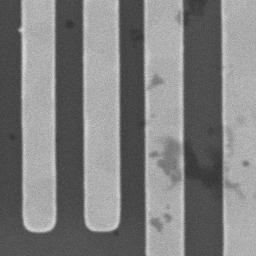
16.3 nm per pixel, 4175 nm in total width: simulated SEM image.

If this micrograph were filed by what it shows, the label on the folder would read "wiring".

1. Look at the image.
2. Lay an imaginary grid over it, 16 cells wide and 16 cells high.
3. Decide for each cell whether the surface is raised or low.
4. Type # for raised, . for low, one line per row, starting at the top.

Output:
.##..##..##...##
.##..##..##...##
.##..##..##...##
.##..##..##...##
.##..##..##...##
.##..##..##...##
.##..##..##...##
.##..##..##...##
.##..##..##...##
.##..##..##...##
.##..##..##...##
.##..##..##...##
.##..##..##...##
.##..##..##...##
.........##...##
.........##...##